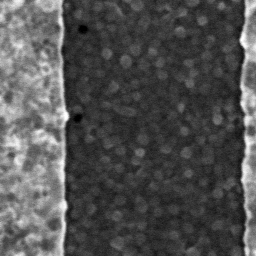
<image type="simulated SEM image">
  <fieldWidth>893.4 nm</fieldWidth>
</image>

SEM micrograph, one or a few lines or trenches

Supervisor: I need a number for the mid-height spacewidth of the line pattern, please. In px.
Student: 182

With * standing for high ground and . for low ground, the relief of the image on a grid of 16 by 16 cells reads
****...........*
****...........*
****...........*
****...........*
****...........*
****...........*
****...........*
****...........*
****...........*
****...........*
****...........*
****...........*
****...........*
****...........*
****...........*
****...........*